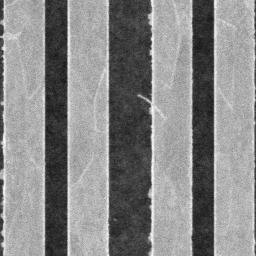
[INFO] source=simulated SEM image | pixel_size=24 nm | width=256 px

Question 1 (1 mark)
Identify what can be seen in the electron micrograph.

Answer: lines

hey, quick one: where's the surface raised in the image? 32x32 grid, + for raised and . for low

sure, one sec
.+++++...++++......+++++...+++++
.+++++...++++......+++++...+++++
.+++++...++++......+++++...+++++
.+++++...++++......+++++...+++++
++++++...++++......+++++...+++++
.+++++...++++......+++++...+++++
.+++++...++++......+++++...+++++
.+++++...++++......+++++...+++++
.+++++...++++......+++++...+++++
.+++++...++++......+++++...+++++
.+++++...++++......+++++...+++++
.+++++...++++......+++++...+++++
.+++++...++++......+++++...+++++
.+++++...++++......+++++...+++++
++++++...++++......+++++...+++++
.+++++...++++......+++++...+++++
.+++++...++++......+++++...+++++
++++++...++++......+++++...+++++
++++++...++++......+++++...+++++
.+++++...++++......+++++...+++++
.+++++...++++......+++++...+++++
.+++++...++++......+++++...+++++
++++++...++++......+++++...+++++
++++++...++++......+++++...+++++
++++++...++++......+++++...+++++
++++++...++++......+++++...+++++
++++++...++++......+++++...+++++
.+++++...++++......+++++...+++++
++++++...++++......+++++...+++++
.+++++...++++......+++++...+++++
.+++++...++++......+++++...+++++
++++++...++++......+++++...+++++